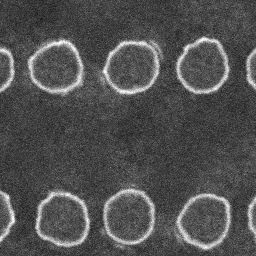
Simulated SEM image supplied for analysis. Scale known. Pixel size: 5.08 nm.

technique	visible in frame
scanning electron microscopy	raised bodies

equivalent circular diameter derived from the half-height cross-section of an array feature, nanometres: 264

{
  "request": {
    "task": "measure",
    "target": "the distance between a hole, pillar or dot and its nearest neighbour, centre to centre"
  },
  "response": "362 nm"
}